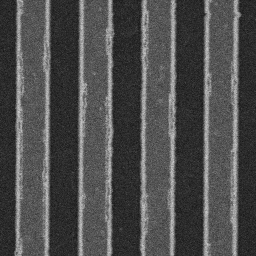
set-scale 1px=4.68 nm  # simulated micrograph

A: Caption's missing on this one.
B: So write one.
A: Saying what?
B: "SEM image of one or a few lines or trenches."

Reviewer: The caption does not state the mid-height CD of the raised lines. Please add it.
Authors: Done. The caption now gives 0.137 µm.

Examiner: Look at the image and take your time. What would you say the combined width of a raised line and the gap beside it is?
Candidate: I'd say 294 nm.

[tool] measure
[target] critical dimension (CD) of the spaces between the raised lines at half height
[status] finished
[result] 0.158 um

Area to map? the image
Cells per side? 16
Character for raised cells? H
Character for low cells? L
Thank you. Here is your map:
LHHLLHHLLHHLLHHL
LHHLLHHLLHHLLHHL
LHHLLHHLLHHLLHHL
LHHLLHHLLHHLLHHL
LHHLLHHLLHHLLHHL
LHHLLHHLLHHLLHHL
LHHLLHHLLHHLLHHL
LHHLLHHLLHHLLHHL
LHHLLHHLLHHLLHHL
LHHLLHHLLHHLLHHL
LHHLLHHLLHHLLHHL
LHHLLHHLLHHLLHHL
LHHLLHHLLHHLLHHL
LHHLLHHLLHHLLHHL
LHHLLHHLLHHLLHHL
LHHLLHHLLHHLLHHL